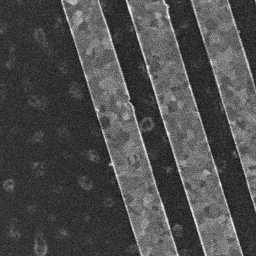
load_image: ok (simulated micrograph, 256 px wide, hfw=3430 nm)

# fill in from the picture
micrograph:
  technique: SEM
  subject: parallel lines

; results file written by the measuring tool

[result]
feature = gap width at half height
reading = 355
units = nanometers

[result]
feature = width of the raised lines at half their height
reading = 34.7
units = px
